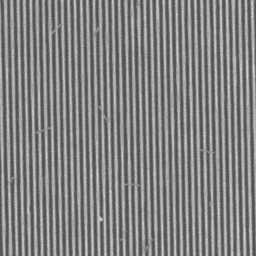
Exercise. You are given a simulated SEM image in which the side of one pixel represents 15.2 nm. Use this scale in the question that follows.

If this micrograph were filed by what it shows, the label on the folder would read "parallel lines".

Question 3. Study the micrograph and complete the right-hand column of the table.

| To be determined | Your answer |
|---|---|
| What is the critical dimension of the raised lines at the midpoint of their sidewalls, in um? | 0.038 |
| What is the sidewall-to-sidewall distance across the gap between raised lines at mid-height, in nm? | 64.6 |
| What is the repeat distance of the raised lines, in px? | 6.33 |